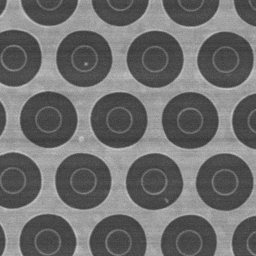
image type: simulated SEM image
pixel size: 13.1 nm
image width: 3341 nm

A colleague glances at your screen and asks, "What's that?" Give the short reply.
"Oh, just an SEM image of an array of small figures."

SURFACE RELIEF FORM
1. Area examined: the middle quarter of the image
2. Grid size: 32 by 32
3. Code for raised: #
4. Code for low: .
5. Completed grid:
...#####....####....#####.....##
....##......####.....###......##
...........######............###
..........#######...........####
#........#########.........#####
###....#############......######
################################
###########......############...
.########.........#########.....
..######...........#######......
...####.............#####.......
...####.....####.....####.....##
...####....######....###.....###
....##.....######....###.....###
....##.....######....###....####
...####....######....###.....###
...####.....####.....####....###
...####.............#####.......
..######...........#######......
.########..........#######......
##########.......###########....
###############################.
##.....#############.....#######
.........##########........#####
..........#######...........####
...........######............###
...###.....#####.....###.....###
..#####.....####....#####....###
..######....###.....#####.....##
..######....###....#######....##
..######....###.....#####.....##
...####.....####....#####.....##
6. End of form